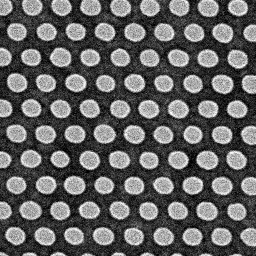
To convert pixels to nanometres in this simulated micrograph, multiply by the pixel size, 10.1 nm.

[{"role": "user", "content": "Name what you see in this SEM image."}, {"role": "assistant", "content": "a regular array of raised bodies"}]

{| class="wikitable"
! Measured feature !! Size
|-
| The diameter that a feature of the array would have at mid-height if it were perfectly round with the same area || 183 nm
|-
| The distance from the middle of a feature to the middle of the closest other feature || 0.292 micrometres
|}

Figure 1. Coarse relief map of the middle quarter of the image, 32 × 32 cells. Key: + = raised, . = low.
.....................++.....++..
................................
................................
.++++....+++....++++...+++.....+
.++++...+++++..+++++...++++...++
.++++...+++++..+++++...++++...++
..+++....+++.....++.....++.....+
................................
................................
.....+++.....++.....++.....++...
+...++++....++++...++++...+++++.
+...+++++...++++...+++++..+++++.
+....+++....++++...++++....++++.
................................
................................
.........++.....................
.++++...++++...+++++...++++....+
+++++...+++++..+++++...++++...++
.++++...+++++..+++++...++++...++
.........+++.....++.....++.....+
................................
................................
.....+++....++++....+++....+++..
+...+++++..+++++...++++...+++++.
+...+++++..+++++...++++...+++++.
.....+++....++++....+++....+++..
................................
................................
.+++.............+......+......+
+++++...++++...+++++...++++...++
+++++...++++...+++++...++++...++
.++++...++++....++++...++++...++